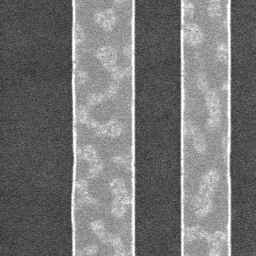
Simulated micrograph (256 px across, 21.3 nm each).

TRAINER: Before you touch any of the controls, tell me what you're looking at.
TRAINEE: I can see one or a few lines or trenches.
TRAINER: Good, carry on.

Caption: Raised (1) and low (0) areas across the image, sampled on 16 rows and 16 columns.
0000011100011100
0000011100011100
0000011100011100
0000011100011100
0000011100011100
0000011100011100
0000011100011100
0000011100011100
0000011100011100
0000011100011100
0000011100011100
0000011100011100
0000011100011100
0000011100011100
0000011100011100
0000011100011100